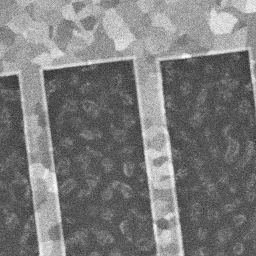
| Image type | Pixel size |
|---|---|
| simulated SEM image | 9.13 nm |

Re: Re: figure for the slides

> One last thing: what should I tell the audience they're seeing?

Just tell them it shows one or a few lines or trenches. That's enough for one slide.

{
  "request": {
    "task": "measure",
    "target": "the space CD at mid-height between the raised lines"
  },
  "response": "856 nanometres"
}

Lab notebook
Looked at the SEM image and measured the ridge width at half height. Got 0.207 um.